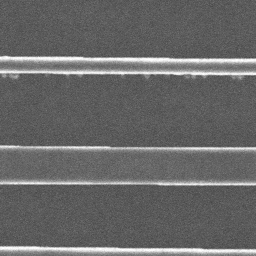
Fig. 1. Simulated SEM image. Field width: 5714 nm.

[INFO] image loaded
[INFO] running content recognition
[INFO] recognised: lines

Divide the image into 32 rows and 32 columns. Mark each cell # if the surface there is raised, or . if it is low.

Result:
................................
................................
................................
................................
................................
................................
................................
#############################...
################################
................................
................................
................................
................................
................................
................................
................................
................................
................................
##############..................
################################
################################
################################
################################
................................
................................
................................
................................
................................
................................
................................
................................
################################